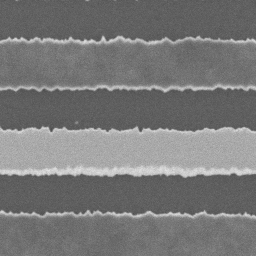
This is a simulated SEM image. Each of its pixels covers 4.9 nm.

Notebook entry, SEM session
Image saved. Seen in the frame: lines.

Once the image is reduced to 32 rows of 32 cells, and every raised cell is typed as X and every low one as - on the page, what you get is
--------------------------------
--------------------------------
--------------------------------
--------------------------------
--------------------------------
XXXXXXXXXXXXXXXXXXXXXXXXXXXXXXXX
XXXXXXXXXXXXXXXXXXXXXXXXXXXXXXXX
XXXXXXXXXXXXXXXXXXXXXXXXXXXXXXXX
XXXXXXXXXXXXXXXXXXXXXXXXXXXXXXXX
XXXXXXXXXXXXXXXXXXXXXXXXXXXXXXXX
XXXXXXXXXXXXXXXXXXXXXXXXXXXXXXXX
--------------------------------
--------------------------------
--------------------------------
--------------------------------
--------------------------------
XXXXXXXXXXXXXXXXXXXXXXXXXXXXXXXX
XXXXXXXXXXXXXXXXXXXXXXXXXXXXXXXX
XXXXXXXXXXXXXXXXXXXXXXXXXXXXXXXX
XXXXXXXXXXXXXXXXXXXXXXXXXXXXXXXX
XXXXXXXXXXXXXXXXXXXXXXXXXXXXXXXX
XXXXXXXXXXXXXXXXXXXXXXXXXXXXXXXX
--------------------------------
--------------------------------
--------------------------------
--------------------------------
X-------------------------------
XXXXXXXXXXXXXXXXXXXXXXXXXXXXXXXX
XXXXXXXXXXXXXXXXXXXXXXXXXXXXXXXX
XXXXXXXXXXXXXXXXXXXXXXXXXXXXXXXX
XXXXXXXXXXXXXXXXXXXXXXXXXXXXXXXX
XXXXXXXXXXXXXXXXXXXXXXXXXXXXXXXX